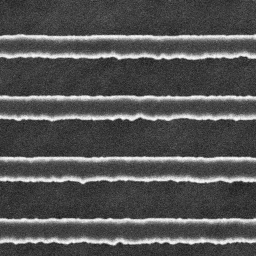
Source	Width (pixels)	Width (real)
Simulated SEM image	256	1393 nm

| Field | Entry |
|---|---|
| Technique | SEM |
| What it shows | lines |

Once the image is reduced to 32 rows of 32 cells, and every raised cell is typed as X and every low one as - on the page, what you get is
--------------------------------
--------------------------------
--------------------------------
--------------------------------
XXXXX------XXXX--XX----X--XXXXXX
XXXXXXXXXXXXXXXXXXXXXXXXXXXXXXXX
XXXXXXXXXXXXXXXXXXXXXXXXXXXXXXXX
--------------------------------
--------------------------------
--------------------------------
--------------------------------
--------------------------------
XXXXXXXXXXXXXXXXXXXXXXXXXXXXXXXX
XXXXXXXXXXXXXXXXXXXXXXXXXXXXXXXX
XXXXXXXXXXXXXXXXXXXXXXXXXXXXXXXX
--------------------------------
--------------------------------
--------------------------------
--------------------------------
--------------------------------
XXXXXXXXXXXXXXXXXXXXXXXXXXXXXXXX
XXXXXXXXXXXXXXXXXXXXXXXXXXXXXXXX
XXXXXXXXXXXX-XX--XXXX-XXXXXXXXXX
--------------------------------
--------------------------------
--------------------------------
--------------------------------
XXXXXXXXXXXXXXXXXXXXXXXXXXXXXXXX
XXXXXXXXXXXXXXXXXXXXXXXXXXXXXXXX
XXXXXXXXXXXXXXXXXXXXXXXXXXXXXXXX
--------------------------------
--------------------------------